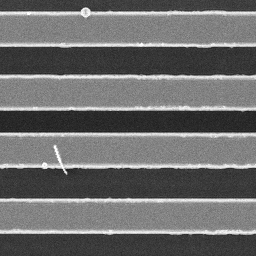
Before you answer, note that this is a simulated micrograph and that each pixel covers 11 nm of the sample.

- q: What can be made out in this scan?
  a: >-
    lines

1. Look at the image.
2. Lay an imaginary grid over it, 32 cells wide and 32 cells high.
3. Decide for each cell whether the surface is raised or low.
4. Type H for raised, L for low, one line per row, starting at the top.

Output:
LLLLLLLLLLLLLLLLLLLLLLLLLLLLLLLL
LLLLLLLLLLHHLLLLLLLLLLLLLHHHLLLL
HHHHHHHHHHHHHHHHHHHHHHHHHHHHHHHH
HHHHHHHHHHHHHHHHHHHHHHHHHHHHHHHH
HHHHHHHHHHHHHHHHHHHHHHHHHHHHHHHH
HHHHHHHHHHHHHHHHHHHHHHHHHHHHHHHH
LLLLLLLLLLLLLLLLLLLLLLLLLLLLLLLL
LLLLLLLLLLLLLLLLLLLLLLLLLLLLLLLL
LLLLLLLLLLLLLLLLLLLLLLLLLLLLLLLL
HHHHHHHLHHLHHHHHHHLHHLLLLLHHLLLH
HHHHHHHHHHHHHHHHHHHHHHHHHHHHHHHH
HHHHHHHHHHHHHHHHHHHHHHHHHHHHHHHH
HHHHHHHHHHHHHHHHHHHHHHHHHHHHHHHH
HHHHHHHHHHHHHHHHHHHHHHHHHHHHHHHH
LLLLLLLLLLLLLLLLLLLLLLLLLLLLLLLL
LLLLLLLLLLLLLLLLLLLLLLLLLLLLLLLL
LLLLLLLLLLLLLLLLLLLLLLLLLLLLLLLL
HHHHHHHHHHHHHHHHHHHHHHHHHHHHHHHH
HHHHHHHHHHHHHHHHHHHHHHHHHHHHHHHH
HHHHHHHHHHHHHHHHHHHHHHHHHHHHHHHH
HHHHHHHHHHHHHHHHHHHHHHHHHHHHHHHH
LLLLLLLLLLLLLLLLLLLLLLLLLLLLLLLL
LLLLLLLLLLLLLLLLLLLLLLLLLLLLLLLL
LLLLLLLLLLLLLLLLLLLLLLLLLLLLLLLL
LLLLLLLLLLLLLLLLLLLLLLLLLLLLLLLL
HHHHHHHHHHHHHHHHHHHHHHHHHHHHHHHH
HHHHHHHHHHHHHHHHHHHHHHHHHHHHHHHH
HHHHHHHHHHHHHHHHHHHHHHHHHHHHHHHH
HHHHHHHHHHHHHHHHHHHHHHHHHHHHHHHH
LLLLLLLLLLLLLLLLLLLLLLLLLLLLLLLL
LLLLLLLLLLLLLLLLLLLLLLLLLLLLLLLL
LLLLLLLLLLLLLLLLLLLLLLLLLLLLLLLL